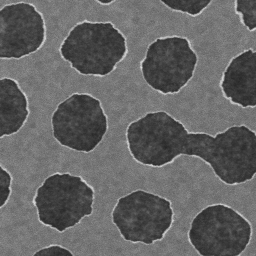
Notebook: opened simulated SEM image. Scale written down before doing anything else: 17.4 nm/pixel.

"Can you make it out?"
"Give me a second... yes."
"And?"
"holes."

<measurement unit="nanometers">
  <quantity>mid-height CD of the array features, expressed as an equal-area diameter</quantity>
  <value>962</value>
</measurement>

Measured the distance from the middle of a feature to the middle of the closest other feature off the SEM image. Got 1330 nm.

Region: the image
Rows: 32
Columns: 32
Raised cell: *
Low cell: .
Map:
**.******************.....****..
.....******************..*****..
.....*************************..
......***.....*****************.
......**.......*****************
.....***........***.....********
....****........**......*******.
********.......***.......****...
*********.....****......****....
******************......****....
..*****************....*****....
...*****************..******....
...*****....*****************...
...****......*******************
...****......*****...***********
...****......***.......*********
..*****......***........****....
*******......***................
*********...****................
*****************.....**........
******************...*****......
.**************************.....
.*****....******************...*
.****......*********************
.***........****....************
****.......****......***********
*****......***.......****....***
*****.....****.......***.......*
*******..******......***.......*
***************.....****.......*
************************.......*
*****....****************.....**